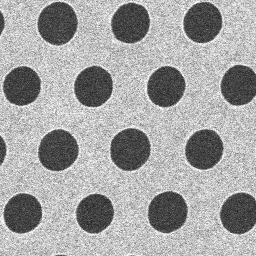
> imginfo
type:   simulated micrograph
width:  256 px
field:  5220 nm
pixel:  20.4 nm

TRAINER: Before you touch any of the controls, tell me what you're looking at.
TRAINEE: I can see a regular array of holes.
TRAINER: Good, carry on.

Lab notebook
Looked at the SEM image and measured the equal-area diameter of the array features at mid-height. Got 825 nanometres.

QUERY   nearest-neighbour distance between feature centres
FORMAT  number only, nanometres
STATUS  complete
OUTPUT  1470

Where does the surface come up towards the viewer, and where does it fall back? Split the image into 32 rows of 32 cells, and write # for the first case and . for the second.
######...#######.#######...#####
#####....#####....#####.....####
.####.....####.....####.....####
.####.....####.....####.....####
#####....#####....#####....#####
######..########################
################################
################################
##..#######..#######..#######..#
#....#####....#####....#####....
.....####.....####.....#####....
.....####.....####.....#####....
#...######...######....#####....
################################
################################
################################
######...######...######...#####
.####....#####.....####.....####
.####.....####.....####.....####
.####.....####.....####.....####
#####....#####....######...#####
################################
################################
################################
##..#######..######....######...
#....#####....#####....#####....
.....####.....####......###.....
#....#####....#####....#####....
#...######...######...######....
################################
################################
################################